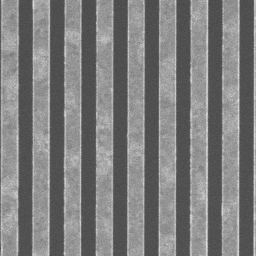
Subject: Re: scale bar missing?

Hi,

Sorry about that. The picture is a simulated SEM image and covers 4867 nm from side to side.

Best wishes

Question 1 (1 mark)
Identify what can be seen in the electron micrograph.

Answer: parallel lines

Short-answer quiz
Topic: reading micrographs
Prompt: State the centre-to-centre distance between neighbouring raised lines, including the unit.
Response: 600 nm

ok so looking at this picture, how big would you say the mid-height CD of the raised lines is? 304 nm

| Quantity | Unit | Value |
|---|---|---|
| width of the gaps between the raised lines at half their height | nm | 292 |